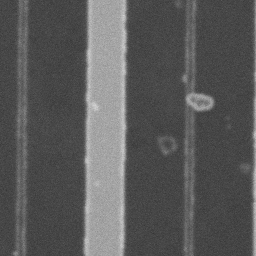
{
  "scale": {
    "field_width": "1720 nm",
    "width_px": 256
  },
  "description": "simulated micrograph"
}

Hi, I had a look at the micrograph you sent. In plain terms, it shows lines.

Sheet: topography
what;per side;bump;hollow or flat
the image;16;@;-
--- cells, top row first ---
------@@--------
------@@--------
------@@--------
------@@--------
------@@--------
------@@--------
-----@@@----@---
-----@@@--------
-----@@@--------
-----@@@--------
-----@@@--------
-----@@@--------
-----@@@--------
-----@@@--------
-----@@@--------
-----@@@--------